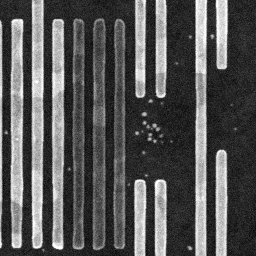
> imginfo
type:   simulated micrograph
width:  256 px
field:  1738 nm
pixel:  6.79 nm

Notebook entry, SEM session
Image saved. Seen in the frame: wiring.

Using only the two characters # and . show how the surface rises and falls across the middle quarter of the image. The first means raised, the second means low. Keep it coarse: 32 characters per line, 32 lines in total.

...##...##...##...##...##.......
...##...##...##...##...##.......
...##...##...##...##...##.......
...##...##...##...##...##.......
...##...##...##...##...##.......
...##...##...##...##...##.......
...##...##...##...##...##.......
...##...##...##...##...##.......
...##...##...##.................
...##...##...##.................
...##...##...##.................
...##...##...##.................
...##...##...##.................
...##...##...##.................
..###..###...##.................
..###..###...##.................
..###..###...##.................
..###..###...##.................
..###..###...##.................
..###..###...##.................
..###..###...##.................
...##..###...##.................
...##..###...##.................
...##..###...##.................
...##..###...##.................
...##..###...##.................
...##..###...##.................
...##..###...##.................
...##..###...##.................
...##..###...##...##...##.......
...##..###...##...##...##.......
...##..###...##...##...##.......